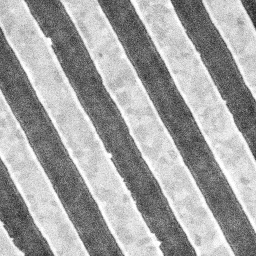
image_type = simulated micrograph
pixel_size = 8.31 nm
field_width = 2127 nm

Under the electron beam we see lines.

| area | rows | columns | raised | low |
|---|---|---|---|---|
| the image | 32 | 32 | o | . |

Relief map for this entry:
ooo.....oooo.....oooo.....oooo..
oooo....ooooo....ooooo....ooooo.
oooo.....oooo.....oooo....ooooo.
ooooo.....oooo....ooooo....ooooo
.ooooo....oooo.....oooo.....oooo
.ooooo.....oooo....ooooo....oooo
..ooooo....ooooo....ooooo....ooo
..ooooo.....oooo....ooooo....ooo
...ooooo....ooooo....ooooo....oo
....oooo.....oooo....ooooo....oo
....ooooo....ooooo....ooooo....o
.....oooo....ooooo....ooooo....o
o....ooooo....ooooo....ooooo....
o.....oooo.....oooo.....oooo....
oo....ooooo....ooooo....ooooo...
oo.....ooooo....oooo.....oooo...
ooo....ooooo....ooooo....ooooo..
ooo.....ooooo....ooooo....ooooo.
oooo....ooooo....ooooo....ooooo.
oooo.....ooooo....ooooo....ooooo
.oooo....ooooo....ooooo....ooooo
.ooooo....ooooo....ooooo....oooo
..oooo.....oooo.....oooo.....ooo
..ooooo....ooooo....ooooo....ooo
...oooo.....oooo.....oooo.....oo
...ooooo....ooooo....ooooo....oo
....oooo.....oooo.....oooo.....o
....ooooo....ooooo....ooooo....o
o....oooo.....oooo.....oooo.....
o.....oooo....ooooo....ooooo....
oo....oooo.....ooooo....oooo....
oo.....oooo....ooooo.....oooo...